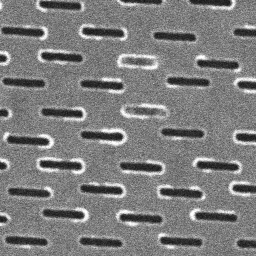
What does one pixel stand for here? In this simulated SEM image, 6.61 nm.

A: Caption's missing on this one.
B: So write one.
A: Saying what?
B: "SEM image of a regular array of holes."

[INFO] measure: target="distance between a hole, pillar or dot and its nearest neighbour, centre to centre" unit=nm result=298